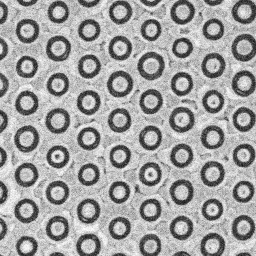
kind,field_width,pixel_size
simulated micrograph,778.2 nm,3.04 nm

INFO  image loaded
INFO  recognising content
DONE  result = a regular array of ring-shaped grooves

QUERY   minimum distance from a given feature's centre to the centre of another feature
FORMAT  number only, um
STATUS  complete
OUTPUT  0.107